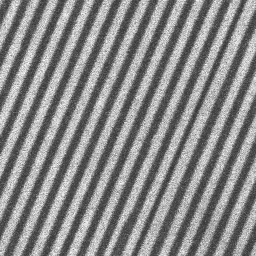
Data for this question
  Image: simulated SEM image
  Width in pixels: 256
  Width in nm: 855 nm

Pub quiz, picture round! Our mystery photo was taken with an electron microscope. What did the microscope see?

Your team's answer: parallel lines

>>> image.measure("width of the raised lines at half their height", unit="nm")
28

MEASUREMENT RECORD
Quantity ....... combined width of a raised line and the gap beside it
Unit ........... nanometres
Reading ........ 56.1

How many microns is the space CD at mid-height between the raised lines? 0.0276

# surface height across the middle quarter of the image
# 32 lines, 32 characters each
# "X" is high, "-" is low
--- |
X--XX--XXX--XX--XXX--XX---XX--XX
--XXX--XX---XX--XX---XX--XXX--XX
--XX---XX--XXX--XX--XXX--XX--XXX
--XX--XX---XX--XXX--XX--XXX--XX-
-XX---XX--XXX--XX--XXX--XX---XX-
-XX--XX---XX--XXX--XX---XX--XX--
XXX--XX--XXX--XX--XXX--XX---XX--
XX--XXX--XX--XXX--XX---XX--XX---
XX--XX---XX--XX---XX--XXX--XX--X
X---XX--XXX--XX--XXX--XX--XXX--X
X--XX---XX--XXX--XX--XXX--XX---X
---XX--XXX--XX--XXX--XX---XX--XX
--XX---XX--XXX--XX---XX--XX---XX
--XX--XXX--XX--XXX--XX---XX--XX-
-XXX--XX---XX--XX---XX--XX---XX-
-XX---XX--XX---XX--XXX--XX--XXX-
-XX--XXX--XX--XXX--XX--XXX--XX--
XX---XX--XXX--XX--XXX--XX---XX--
XX--XXX--XX--XXX--XX--XXX--XX--X
X---XX---XX--XX---XX--XX---XX--X
X--XXX--XX--XXX--XX---XX--XX--XX
X--XX---XX--XX---XX--XX---XX--XX
---XX--XX---XX--XXX--XX--XXX-XXX
--XXX--XX--XXX--XX--XXX--XX--XXX
--XX--XXX--XX--XXX--XX---XX--XX-
-XXX--XX--XXX--XX---XX--XX--XXX-
-XX---XX--XX---XX--XX---XX--XX--
XXX--XX--XXX--XX---XX--XX--XXX--
XX---XX--XX---XX--XX---XX--XXX--
XX--XX---XX--XXX--XX--XXX-XXX--X
XX--XX--XXX--XX--XXX--XX--XXX--X
X--XXX--XX--XXX--XX---XX--XX---X